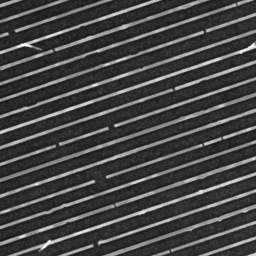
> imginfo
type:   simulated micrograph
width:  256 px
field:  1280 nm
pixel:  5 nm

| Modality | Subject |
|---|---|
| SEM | parallel lines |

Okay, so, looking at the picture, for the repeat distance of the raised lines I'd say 75.7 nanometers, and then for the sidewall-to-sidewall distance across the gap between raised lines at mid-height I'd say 61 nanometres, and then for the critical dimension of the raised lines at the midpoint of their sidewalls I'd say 13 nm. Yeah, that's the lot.